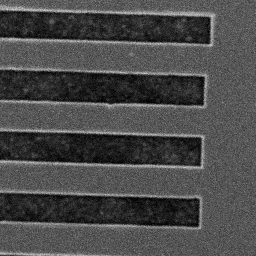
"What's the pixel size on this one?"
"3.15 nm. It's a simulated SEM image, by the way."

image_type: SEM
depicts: one or a few lines or trenches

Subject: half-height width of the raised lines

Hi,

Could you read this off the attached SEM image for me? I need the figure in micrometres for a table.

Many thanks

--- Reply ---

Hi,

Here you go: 0.0981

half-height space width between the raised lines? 94.1 nm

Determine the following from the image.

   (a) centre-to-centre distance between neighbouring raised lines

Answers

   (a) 0.193 µm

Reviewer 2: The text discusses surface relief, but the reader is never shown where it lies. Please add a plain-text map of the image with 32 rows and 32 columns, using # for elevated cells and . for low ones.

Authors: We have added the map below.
################################
..........######################
..........................######
..........................######
..........................######
#####################.....######
################################
################################
################################
.........................#######
..........................######
..........................######
..........................######
################################
################################
################################
.........#######################
.........................#######
.........................#######
.........................#######
########.................#######
################################
################################
################################
..................##############
.........................#######
.........................#######
.........................#######
################################
################################
################################
################################